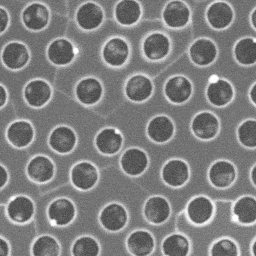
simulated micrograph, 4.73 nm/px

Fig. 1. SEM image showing a regular array of holes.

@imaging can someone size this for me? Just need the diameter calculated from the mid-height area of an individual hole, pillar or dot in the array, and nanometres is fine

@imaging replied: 127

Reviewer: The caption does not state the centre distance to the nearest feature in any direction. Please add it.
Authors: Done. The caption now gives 0.195 µm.